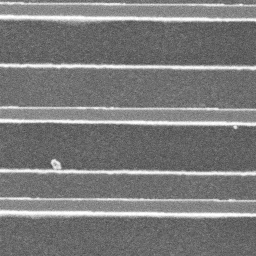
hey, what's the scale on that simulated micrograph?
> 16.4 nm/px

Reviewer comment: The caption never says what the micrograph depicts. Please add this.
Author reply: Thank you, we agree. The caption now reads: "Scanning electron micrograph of lines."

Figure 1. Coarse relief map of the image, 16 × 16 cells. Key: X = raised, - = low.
XXXXXXXXXXXXXXXX
----------------
----------------
----------------
XXXXXXXXXXXXXXXX
XXXXXXXXXXXXXXXX
XXXXXXXXXXXXXXXX
XXXXXXXXXXXXXXXX
----------------
----------------
----------------
XXXXXXXXXXXXXXXX
XXXXXXXXXXXXXXXX
----------------
----------------
----------------